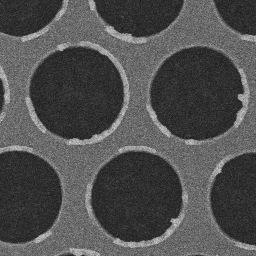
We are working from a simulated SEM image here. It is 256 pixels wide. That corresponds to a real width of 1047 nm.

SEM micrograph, holes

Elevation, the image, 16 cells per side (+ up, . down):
....++.....+++..
...++++....+++..
++++++++++++++++
+++....++++...++
++.....+++.....+
++......+......+
++......+......+
++.....+++.....+
++++..+++++...++
..++++++.+++++++
...+++.....+++..
....++.....++...
....++.....++...
....++.....++...
...++++...++++..
++++++++++++++++